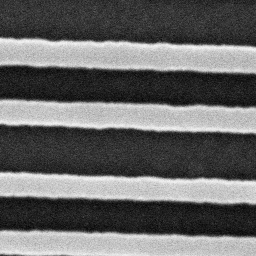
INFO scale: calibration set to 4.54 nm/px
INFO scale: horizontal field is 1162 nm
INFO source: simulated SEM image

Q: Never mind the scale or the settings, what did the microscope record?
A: lines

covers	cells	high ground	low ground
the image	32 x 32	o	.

................................
................................
................................
................................
................................
oooooooooooooooo................
oooooooooooooooooooooooooooooooo
oooooooooooooooooooooooooooooooo
...............ooooooooooooooooo
................................
................................
................................
................................
oooooooooooooooooooooo.ooo......
oooooooooooooooooooooooooooooooo
....oooooooooooooooooooooooooooo
................................
................................
................................
................................
................................
................................
oooooooooooooooooooo............
oooooooooooooooooooooooooooooooo
......oooooooooooooooooooooooooo
................................
................................
................................
................................
ooooooooooooooo.................
oooooooooooooooooooooooooooooooo
oooooooooooooooooooooooooooooooo